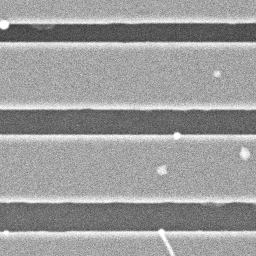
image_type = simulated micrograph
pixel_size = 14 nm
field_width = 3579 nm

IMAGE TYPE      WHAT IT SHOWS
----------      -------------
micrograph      lines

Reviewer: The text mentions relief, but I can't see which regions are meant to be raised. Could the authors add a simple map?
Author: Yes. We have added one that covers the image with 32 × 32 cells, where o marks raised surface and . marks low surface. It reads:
oooooooooooooooooooooooooooooooo
oooooooooooooooooooooooooooooooo
oooooooooooooooooooooooooooooooo
o...............................
................................
oooooooooooooooooooooooooooooooo
oooooooooooooooooooooooooooooooo
oooooooooooooooooooooooooooooooo
oooooooooooooooooooooooooooooooo
oooooooooooooooooooooooooooooooo
oooooooooooooooooooooooooooooooo
oooooooooooooooooooooooooooooooo
oooooooooooooooooooooooooooooooo
oooooooooooooooooooooooooooooooo
................................
................................
................................
oooooooooooooooooooooooooooooooo
oooooooooooooooooooooooooooooooo
oooooooooooooooooooooooooooooooo
oooooooooooooooooooooooooooooooo
oooooooooooooooooooooooooooooooo
oooooooooooooooooooooooooooooooo
oooooooooooooooooooooooooooooooo
oooooooooooooooooooooooooooooooo
................................
................................
................................
................................
oooooooooooooooooooooooooooooooo
oooooooooooooooooooooooooooooooo
oooooooooooooooooooooooooooooooo